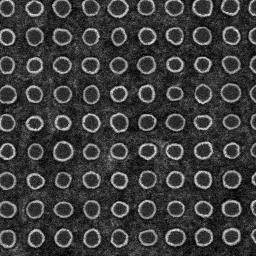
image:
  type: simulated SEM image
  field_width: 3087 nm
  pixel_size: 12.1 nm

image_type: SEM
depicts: a regular array of raised bodies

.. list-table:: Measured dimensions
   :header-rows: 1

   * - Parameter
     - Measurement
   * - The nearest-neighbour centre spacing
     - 0.335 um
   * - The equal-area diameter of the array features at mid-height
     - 201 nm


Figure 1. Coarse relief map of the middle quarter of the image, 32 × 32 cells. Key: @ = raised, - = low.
@@---@@@@---@@@@---@@@@---@@@@--
@----@@@----@@@----@@@-----@@---
--------------------------------
--------------------------------
--------------------------------
------@@------------@-----------
@----@@@----@@@----@@@----@@@---
@@---@@@@---@@@@---@@@----@@@@--
@----@@@@---@@@----@@@----@@@---
@-----@@------------------------
--------------------------------
--------------------------------
------@------@------------------
@----@@@@---@@@@---@@@@---@@@@--
@@---@@@@---@@@@---@@@@---@@@@--
@----@@@@---@@@@---@@@----@@@@--
------@@-----@@-------------@---
--------------------------------
--------------------------------
@-------------------------------
@@----@@----@@@----@@@@---@@@---
@@---@@@@---@@@@---@@@@---@@@@--
@@---@@@@---@@@@---@@@@---@@@@--
@@----@@-----@@-----@@-----@@---
--------------------------------
--------------------------------
--------------------------------
@----@@@-----@@----@@@@----@@---
@@---@@@@---@@@@---@@@@---@@@@--
@@---@@@@---@@@@---@@@@---@@@@--
@-----@@-----@@-----@@----@@@---
--------------------------------